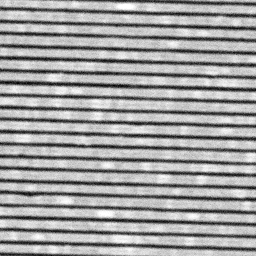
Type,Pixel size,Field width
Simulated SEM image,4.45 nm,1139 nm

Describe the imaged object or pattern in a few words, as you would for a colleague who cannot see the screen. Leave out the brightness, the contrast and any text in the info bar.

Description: parallel lines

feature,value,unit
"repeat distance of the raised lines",54.5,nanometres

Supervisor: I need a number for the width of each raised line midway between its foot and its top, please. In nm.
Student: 36.7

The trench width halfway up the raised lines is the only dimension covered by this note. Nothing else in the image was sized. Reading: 16.1 nm